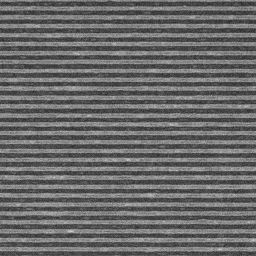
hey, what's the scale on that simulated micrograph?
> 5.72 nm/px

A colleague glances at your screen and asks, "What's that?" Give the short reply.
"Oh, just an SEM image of parallel lines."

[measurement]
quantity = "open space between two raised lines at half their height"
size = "28.6 nanometers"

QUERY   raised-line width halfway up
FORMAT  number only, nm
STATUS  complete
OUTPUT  23.6